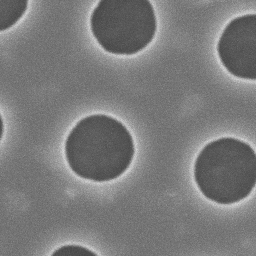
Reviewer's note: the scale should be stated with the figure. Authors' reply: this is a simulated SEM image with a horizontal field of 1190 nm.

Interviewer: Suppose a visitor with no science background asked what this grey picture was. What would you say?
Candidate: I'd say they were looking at holes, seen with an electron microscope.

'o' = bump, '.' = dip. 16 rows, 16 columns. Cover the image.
..oooo....oooooo
.ooooo....oooo..
oooooo....oooo..
oooooooooooooo..
oooooooooooooo..
oooooooooooooooo
oooooooooooooooo
ooooo..ooooooooo
oooo....oooooooo
oooo....oooo....
oooo....oooo....
oooooooooooo....
ooooooooooooo..o
oooooooooooooooo
oooooooooooooooo
oooo.ooooooooooo